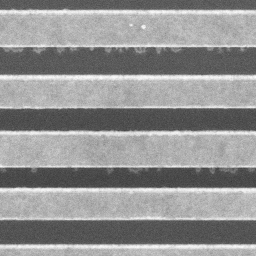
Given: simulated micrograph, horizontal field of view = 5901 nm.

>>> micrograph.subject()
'lines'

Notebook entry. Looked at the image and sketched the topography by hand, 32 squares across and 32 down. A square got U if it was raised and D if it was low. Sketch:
DDDDDDDDDDDDDDDDDDDDDDDDDDDDDDDD
UUUUUUUUUUUUUUUUUUUUUUUUUUUUUUUU
UUUUUUUUUUUUUUUUUUUUUUUUUUUUUUUU
UUUUUUUUUUUUUUUUUUUUUUUUUUUUUUUU
UUUUUUUUUUUUUUUUUUUUUUUUUUUUUUUU
UUUUUUUUUUUUUUUUUUUUUUUUUUUUUUUU
DDDDDDDDDDDDDDDDDDDDDDDDDDDDDDDD
DDDDDDDDDDDDDDDDDDDDDDDDDDDDDDDD
DDDDDDDDDDDDDDDDDDDDDDDDDDDDDDDD
UUUUUUUUUUUUUUUUUUUUUUUUUUUUUUUU
UUUUUUUUUUUUUUUUUUUUUUUUUUUUUUUU
UUUUUUUUUUUUUUUUUUUUUUUUUUUUUUUU
UUUUUUUUUUUUUUUUUUUUUUUUUUUUUUUU
UUUUUUDUDDDDDDDDDDDDDDDDDDDDDDDD
DDDDDDDDDDDDDDDDDDDDDDDDDDDDDDDD
DDDDDDDDDDDDDDDDDDDDDDDDDDDDDDDD
DDDDDDDDDDDDDDDDDDDUDUUDUDUUUDUD
UUUUUUUUUUUUUUUUUUUUUUUUUUUUUUUU
UUUUUUUUUUUUUUUUUUUUUUUUUUUUUUUU
UUUUUUUUUUUUUUUUUUUUUUUUUUUUUUUU
UUUUUUUUUUUUUUUUUUUUUUUUUUUUUUUU
DDDDDDDDDDDDDDDDDDDDDDDDDDDDDDDD
DDDDDDDDDDDDDDDDDDDDDDDDDDDDDDDD
DDDDDDDDDDDDDDDDDDDDDDDDDDDDDDDD
UUUUUUUUUUUUUUUUUUUUUUUUUUUUUUUU
UUUUUUUUUUUUUUUUUUUUUUUUUUUUUUUU
UUUUUUUUUUUUUUUUUUUUUUUUUUUUUUUU
DDDDDDDDDDDDDDDDDDDDDDDDDDDDDDDD
DDDDDDDDDDDDDDDDDDDDDDDDDDDDDDDD
DDDDDDDDDDDDDDDDDDDDDDDDDDDDDDDD
DDDDDDDDDDDDDDDDDDDDDDDDDDDDDDDD
UUUUUUUUUUUUUUUUUUUUUUUUUUUUUUUU